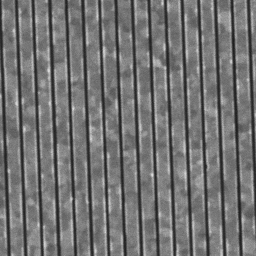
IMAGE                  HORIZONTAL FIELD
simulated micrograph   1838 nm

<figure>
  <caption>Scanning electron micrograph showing parallel lines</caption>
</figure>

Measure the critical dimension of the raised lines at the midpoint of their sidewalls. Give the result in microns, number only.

0.0888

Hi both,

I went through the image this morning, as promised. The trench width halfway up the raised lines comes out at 27.8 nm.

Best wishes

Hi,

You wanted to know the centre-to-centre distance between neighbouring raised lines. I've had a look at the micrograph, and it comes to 0.119 um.